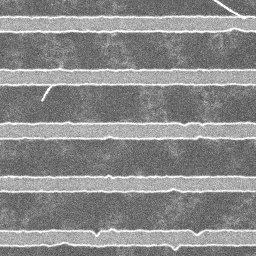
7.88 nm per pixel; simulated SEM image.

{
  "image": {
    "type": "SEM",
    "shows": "parallel lines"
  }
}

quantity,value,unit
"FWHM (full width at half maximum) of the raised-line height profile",309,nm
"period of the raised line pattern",422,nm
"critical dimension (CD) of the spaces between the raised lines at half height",108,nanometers